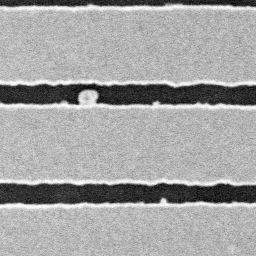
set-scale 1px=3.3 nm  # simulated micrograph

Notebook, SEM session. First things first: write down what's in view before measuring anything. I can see lines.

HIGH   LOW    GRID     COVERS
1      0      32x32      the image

00000000000000000000000000000000
11111111111111111111111111111111
11111111111111111111111111111111
11111111111111111111111111111111
11111111111111111111111111111111
11111111111111111111111111111111
11111111111111111111111111111111
11111111111111111111111111111111
11111111111111111111111111111111
11111111111111111111111111111111
11111011100011110110011110011111
00000000000000000000000000000000
00000000000000000000000000000000
11111111111111111111111111111111
11111111111111111111111111111111
11111111111111111111111111111111
11111111111111111111111111111111
11111111111111111111111111111111
11111111111111111111111111111111
11111111111111111111111111111111
11111111111111111111111111111111
11111111111111111111111111111111
11111111111111111111111111111111
00000000000000000000000000000000
00000000000000000000000000000000
00000000001000000000000111101111
11111111111111111111111111111111
11111111111111111111111111111111
11111111111111111111111111111111
11111111111111111111111111111111
11111111111111111111111111111111
11111111111111111111111111111111